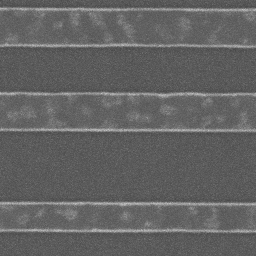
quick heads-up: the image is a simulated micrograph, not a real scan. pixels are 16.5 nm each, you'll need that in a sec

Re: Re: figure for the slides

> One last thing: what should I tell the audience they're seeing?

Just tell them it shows one or a few lines or trenches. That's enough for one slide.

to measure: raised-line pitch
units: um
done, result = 1.56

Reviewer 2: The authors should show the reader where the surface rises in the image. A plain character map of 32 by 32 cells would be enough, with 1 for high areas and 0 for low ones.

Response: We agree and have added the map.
00000000000000000000000000000000
11111111111111111111111111111111
11111111111111111111111111111111
11111111111111111111111111111111
11111111111111111111111111111111
11111111111111111111111111111111
00000000000000000000000000000000
00000000000000000000000000000000
00000000000000000000000000000000
00000000000000000000000000000000
00000000000000000000000000000000
00000000000000000000000000000000
11111111111111111111111111111111
11111111111111111111111111111111
11111111111111111111111111111111
11111111111111111111111111111111
00000000000000000000000000000000
00000000000000000000000000000000
00000000000000000000000000000000
00000000000000000000000000000000
00000000000000000000000000000000
00000000000000000000000000000000
00000000000000000000000000000000
00000000000000000000000000000000
00000000000000000000000000000000
11111111111111111111111100011111
11111111111111111111111111111111
11111111111111111111111111111111
11111111111111111111111111111111
00000000000000000000000000000000
00000000000000000000000000000000
00000000000000000000000000000000